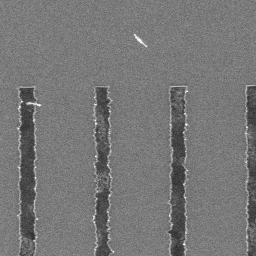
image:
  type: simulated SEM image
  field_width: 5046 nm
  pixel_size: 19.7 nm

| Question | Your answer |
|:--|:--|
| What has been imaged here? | one or a few lines or trenches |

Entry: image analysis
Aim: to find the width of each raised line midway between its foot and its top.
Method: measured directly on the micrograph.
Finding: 0.286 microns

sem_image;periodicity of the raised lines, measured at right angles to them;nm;1480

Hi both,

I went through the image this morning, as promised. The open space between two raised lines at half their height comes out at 1200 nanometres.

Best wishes